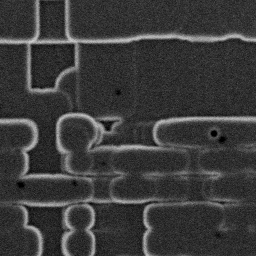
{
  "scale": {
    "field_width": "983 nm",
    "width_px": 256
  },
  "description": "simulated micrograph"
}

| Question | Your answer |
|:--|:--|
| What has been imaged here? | wiring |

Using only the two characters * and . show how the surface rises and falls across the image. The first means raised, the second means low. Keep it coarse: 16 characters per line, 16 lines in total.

**..************
**..************
**...***.......*
................
................
................
................
....**.....*****
**..**....******
**..************
**..************
****************
****************
**..**...*******
**..**...*******
***.**...*******